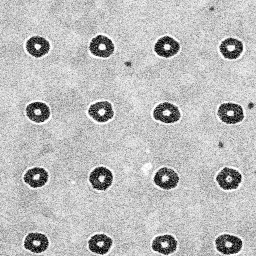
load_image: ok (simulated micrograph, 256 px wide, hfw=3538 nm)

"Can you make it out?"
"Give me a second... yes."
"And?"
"a regular array of ring-shaped grooves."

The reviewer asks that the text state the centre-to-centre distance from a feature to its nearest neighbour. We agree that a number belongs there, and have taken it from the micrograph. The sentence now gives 887 nanometers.